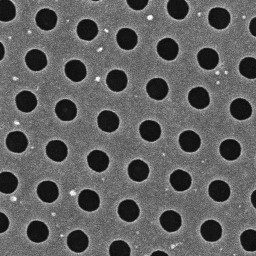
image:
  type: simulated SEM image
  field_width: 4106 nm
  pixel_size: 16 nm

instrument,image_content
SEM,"a regular array of holes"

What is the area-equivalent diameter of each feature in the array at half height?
0.359 micrometres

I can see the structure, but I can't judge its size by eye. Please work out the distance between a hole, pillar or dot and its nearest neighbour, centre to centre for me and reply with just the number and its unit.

0.658 microns